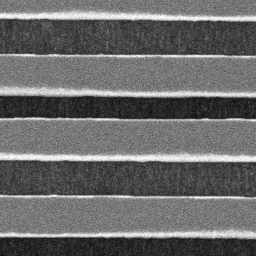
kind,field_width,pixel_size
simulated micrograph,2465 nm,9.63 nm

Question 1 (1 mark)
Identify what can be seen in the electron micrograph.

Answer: lines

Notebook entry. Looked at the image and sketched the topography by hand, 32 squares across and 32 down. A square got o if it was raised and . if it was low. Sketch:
oooooooooooooooooooooooooooooooo
oooooooooooooooooooooooooooooooo
................................
................................
................................
................................
................................
oooooooooooooooooooooooooooooooo
oooooooooooooooooooooooooooooooo
oooooooooooooooooooooooooooooooo
oooooooooooooooooooooooooooooooo
oooooooooooooooooooooooooooooooo
................................
................................
................................
oooooooooooooooooooooooooooooooo
oooooooooooooooooooooooooooooooo
oooooooooooooooooooooooooooooooo
oooooooooooooooooooooooooooooooo
oooooooooooooooooooooooooooooooo
................................
................................
................................
................................
o.....oo........................
oooooooooooooooooooooooooooooooo
oooooooooooooooooooooooooooooooo
oooooooooooooooooooooooooooooooo
oooooooooooooooooooooooooooooooo
oooooooooooooooooooooooooooooooo
................................
................................